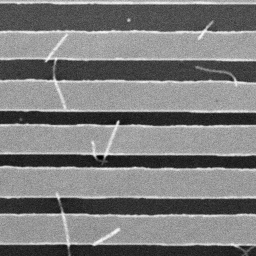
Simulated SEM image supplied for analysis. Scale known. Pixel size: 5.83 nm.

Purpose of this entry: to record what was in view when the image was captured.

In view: lines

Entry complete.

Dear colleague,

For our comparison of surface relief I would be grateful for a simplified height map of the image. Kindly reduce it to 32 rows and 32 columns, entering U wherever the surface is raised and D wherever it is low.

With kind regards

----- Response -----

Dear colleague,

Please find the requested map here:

DDDDDDDDDDDDDDDDDDDDDDDDDDDDDDDD
DDDDDDDDDDDDDDDDDDDDDDDDDDDDDDDD
DDDDDDDDDDDDDDDDDDDDDDDDDDDDDDDD
DDDDDDDDDDDDDDDDDDDDDDDDDDDDDDDD
UUUUUUUUUUUUUUUUUUUUUUUUUUUUUUUU
UUUUUUUUUUUUUUUUUUUUUUUUUUUUUUUU
UUUUUUUUUUUUUUUUUUUUUUUUUUUUUUUU
DDDDDDDDDDDDDDDDDDDDDDUDDDDUUUUU
DDDDDDDDDDDDDDDDDDDDDDDDDDDDDDDD
DDDDDDDDDDDDDDDDDDDDDDDDDDDDDDDD
UUUUUUUUUUUUUUUUUUUUUUUUUUUUUUUU
UUUUUUUUUUUUUUUUUUUUUUUUUUUUUUUU
UUUUUUUUUUUUUUUUUUUUUUUUUUUUUUUU
UUUUUUUUUUUUUUUUUUUUUUUUUUUUUUUU
DDDDDDDDDDDDDDDDDDDDDDDDDDDDDDDD
DDUUDDDDDDDDDDDDDDDDDDDDDDDDDDDD
UUUUUUUUUUUUUUUUUUUUUUUUUUUUUUUU
UUUUUUUUUUUUUUUUUUUUUUUUUUUUUUUU
UUUUUUUUUUUUUUUUUUUUUUUUUUUUUUUU
DDDDDDDDDDDDDDDDDDDDDDDDDDDDDDDD
DDDDDDDDDDDDDDDDDDDDDDDDDDDDDDDD
UUUUUUUUUUUUUUUUUUUUUUUUUUUUUUUU
UUUUUUUUUUUUUUUUUUUUUUUUUUUUUUUU
UUUUUUUUUUUUUUUUUUUUUUUUUUUUUUUU
UUUUUUUUUUUUUUUUUUUUUUUUUUUUUUUU
DDDDDDDDDDDDDDDDDDDDDDDDDDDDDDDD
DDDDDDDDDDDDDDDDDDDDDDDDDDDDDDDD
UUUUUUUUUUUUUUUUUUUUUUUUUUUUUUUU
UUUUUUUUUUUUUUUUUUUUUUUUUUUUUUUU
UUUUUUUUUUUUUUUUUUUUUUUUUUUUUUUU
UUUUUUUUUUUUUUUUUUUUUUUUUUUUUUUU
DDDDDDDDDDDDDDDDDDDDDDDDDDDDDDDD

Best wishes